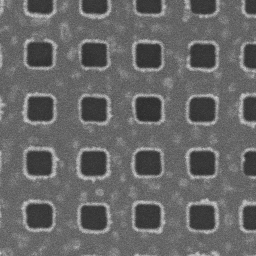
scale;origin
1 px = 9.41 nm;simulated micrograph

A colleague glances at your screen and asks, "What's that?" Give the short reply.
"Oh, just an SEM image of a regular array of holes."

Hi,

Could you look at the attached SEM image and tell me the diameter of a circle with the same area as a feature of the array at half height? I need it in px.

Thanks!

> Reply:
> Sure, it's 28.2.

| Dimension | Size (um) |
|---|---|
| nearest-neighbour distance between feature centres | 0.507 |